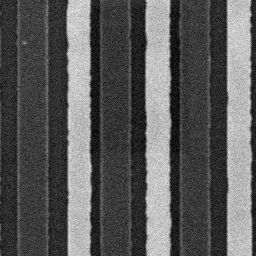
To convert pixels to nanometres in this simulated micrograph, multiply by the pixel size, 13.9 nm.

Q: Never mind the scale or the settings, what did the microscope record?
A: lines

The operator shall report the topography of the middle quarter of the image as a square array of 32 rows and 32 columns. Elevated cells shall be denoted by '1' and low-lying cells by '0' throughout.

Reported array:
01111100011111110000011111000111
01111100011111110000011111000111
01111100011111110000011111000111
01111110011111110000011111000111
01111110011111110000011111000111
01111100011111110000011111000111
01111100011111110000011111000111
01111100011111110000011111000111
01111110011111110000011111000111
01111110011111110000011111000111
01111100011111110000011111000111
01111110011111110000011111000111
01111110011111110000011111000111
01111100011111110000011111000111
01111110011111110000011111000111
01111110011111111000011111000111
01111110011111110000011111000111
01111110011111110000011111000111
01111110011111110000011111000111
01111100011111110000011111000111
01111100011111110000011111000111
01111100011111111000011111000111
01111110011111110000011111000111
01111110011111110000011111000111
01111110011111110000011111000111
01111110011111110000011111000111
01111110011111110000011111000111
01111110011111110000011111000111
01111110011111110000011111000111
01111110011111110000011111000111
01111110011111110000011111000111
01111110011111110000011111000111